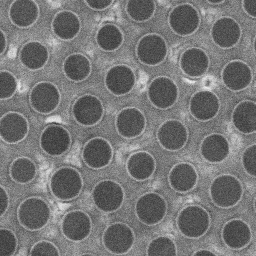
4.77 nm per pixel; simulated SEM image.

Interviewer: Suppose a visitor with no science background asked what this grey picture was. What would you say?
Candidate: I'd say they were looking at a regular array of raised bodies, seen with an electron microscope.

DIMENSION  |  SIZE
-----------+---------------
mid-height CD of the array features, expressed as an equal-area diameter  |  31.6 px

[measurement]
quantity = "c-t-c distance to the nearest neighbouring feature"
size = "0.208 µm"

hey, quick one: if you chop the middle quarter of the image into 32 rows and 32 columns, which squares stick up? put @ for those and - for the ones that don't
@@@@@@@-----@@@@-------------@@@
@@@@@@@----@@@@@@------------@@@
@@@@@@-----@@@@@@@------------@@
-@@@@@----@@@@@@@@-----@@@------
---@------@@@@@@@@----@@@@@@----
----------@@@@@@@@---@@@@@@@----
-----------@@@@@@----@@@@@@@@---
------------@@@@-----@@@@@@@@---
----@@@@@------------@@@@@@@@---
---@@@@@@-------------@@@@@@---@
--@@@@@@@@------------@@@@@----@
--@@@@@@@@----@@@@@------------@
--@@@@@@@@---@@@@@@@------------
---@@@@@@----@@@@@@@------------
---@@@@@@----@@@@@@@-----@@@@---
-----@@------@@@@@@@----@@@@@@--
@------------@@@@@@@---@@@@@@@@-
@-------------@@@@@----@@@@@@@@-
@@-----@@------@@------@@@@@@@@-
@@----@@@@@-------------@@@@@@@-
@@---@@@@@@@------------@@@@@@--
@----@@@@@@@--------------@@@---
-----@@@@@@@-----@@@@@----------
-----@@@@@@@----@@@@@@----------
-----@@@@@@@----@@@@@@@---------
------@@@@------@@@@@@@-----@@@@
@@@-------------@@@@@@@----@@@@@
@@@@------------@@@@@@----@@@@@@
@@@@-------------@@@@-----@@@@@@
@@@@@----@@@@-------------@@@@@@
@@@@@---@@@@@@-------------@@@@@
@@@@---@@@@@@@@------------@@@@@